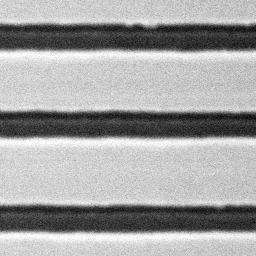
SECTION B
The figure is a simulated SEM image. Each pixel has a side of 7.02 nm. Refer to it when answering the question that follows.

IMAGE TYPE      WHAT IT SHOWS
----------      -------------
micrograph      lines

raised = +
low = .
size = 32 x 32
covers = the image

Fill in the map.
++++++++++++++++++++++++++++++++
++++++++++++++++++++++++++++++++
++++++++++++++++++++++++++++++++
................................
................................
................................
+++++++.++.+++++++++.....+++++++
++++++++++++++++++++++++++++++++
++++++++++++++++++++++++++++++++
++++++++++++++++++++++++++++++++
++++++++++++++++++++++++++++++++
++++++++++++++++++++++++++++++++
++++++++++++++++++++++++++++++++
++++++++++++++++++++++++++++++++
................................
................................
................................
++++++++++++++++++..++++++++++++
++++++++++++++++++++++++++++++++
++++++++++++++++++++++++++++++++
++++++++++++++++++++++++++++++++
++++++++++++++++++++++++++++++++
++++++++++++++++++++++++++++++++
++++++++++++++++++++++++++++++++
++++++++++++++++++++++++++++++++
.......+++++++.....++++++++..+.+
................................
................................
................................
++++++++++++++++++++++++++++++++
++++++++++++++++++++++++++++++++
++++++++++++++++++++++++++++++++